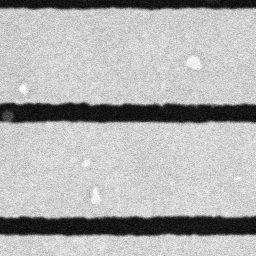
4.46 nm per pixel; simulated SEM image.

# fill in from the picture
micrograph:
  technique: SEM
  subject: lines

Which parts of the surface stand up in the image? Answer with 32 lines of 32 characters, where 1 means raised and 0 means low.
00000000000000000000000000000000
11111111111111111111111111111111
11111111111111111111111111111111
11111111111111111111111111111111
11111111111111111111111111111111
11111111111111111111111111111111
11111111111111111111111111111111
11111111111111111111111111111111
11111111111111111111111111111111
11111111111111111111111111111111
11111111111111111111111111111111
11111111111111111111111111111111
11111111111111111111111111111111
00000000000000000000000000000000
00000000000000000000000000000000
11111111111111111111111111111111
11111111111111111111111111111111
11111111111111111111111111111111
11111111111111111111111111111111
11111111111111111111111111111111
11111111111111111111111111111111
11111111111111111111111111111111
11111111111111111111111111111111
11111111111111111111111111111111
11111111111111111111111111111111
11111111111111111111111111111111
11111111111111111111111111111111
00000000000000000000000000000000
00000000000000000000000000000000
11111111011111011000111110111111
11111111111111111111111111111111
11111111111111111111111111111111